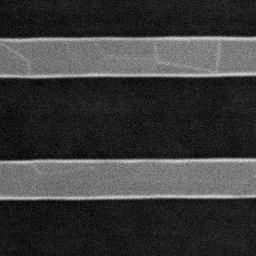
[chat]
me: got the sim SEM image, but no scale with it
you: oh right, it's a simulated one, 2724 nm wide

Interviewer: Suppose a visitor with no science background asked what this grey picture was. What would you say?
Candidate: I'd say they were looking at wiring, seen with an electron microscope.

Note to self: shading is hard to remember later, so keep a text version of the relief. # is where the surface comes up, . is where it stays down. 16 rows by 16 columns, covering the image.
................
................
################
################
################
................
................
................
................
................
################
################
................
................
................
................